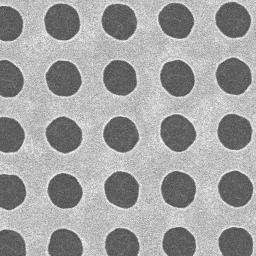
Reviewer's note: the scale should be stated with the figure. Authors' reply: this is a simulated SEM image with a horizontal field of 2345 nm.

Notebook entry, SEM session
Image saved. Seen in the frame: a regular array of holes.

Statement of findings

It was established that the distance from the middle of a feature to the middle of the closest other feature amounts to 56.2 pixels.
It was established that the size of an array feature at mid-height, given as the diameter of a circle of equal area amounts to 35.6 px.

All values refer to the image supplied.